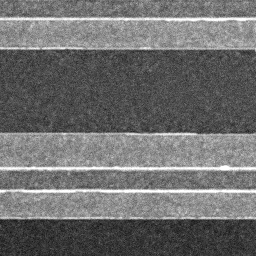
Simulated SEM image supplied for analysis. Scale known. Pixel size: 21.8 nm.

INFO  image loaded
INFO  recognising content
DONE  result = lines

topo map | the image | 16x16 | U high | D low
UUUUUUUUUUUUUUUU
UUUUUUUUUUUUUUUU
UUUUUUUUUUUUUUUU
DDDDDDDDDDDDDDDD
DDDDDDDDDDDDDDDD
DDDDDDDDDDDDDDDD
DDDDDDDDDDDDDDDD
DDDDDDDDDDDDDDDD
UUUUUUUUUUUUUUUU
UUUUUUUUUUUUUUUU
UUUUUUUUUUUUUUUU
UUUUUUUUUUUUUUUU
UUUUUUUUUUUUUUUU
UUUUUUUUUUUUUUUU
DDDDDDDDDDDDDDDD
DDDDDDDDDDDDDDDD